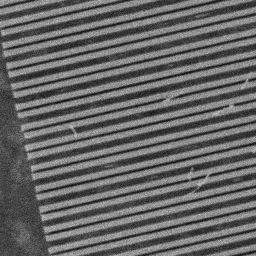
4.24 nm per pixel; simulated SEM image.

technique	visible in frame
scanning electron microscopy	parallel lines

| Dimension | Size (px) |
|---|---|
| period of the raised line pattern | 10.5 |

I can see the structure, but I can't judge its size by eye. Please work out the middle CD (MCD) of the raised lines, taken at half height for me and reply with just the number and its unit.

23.3 nanometers